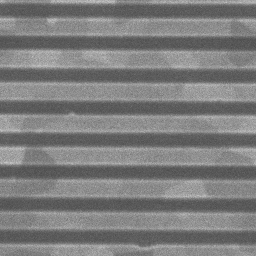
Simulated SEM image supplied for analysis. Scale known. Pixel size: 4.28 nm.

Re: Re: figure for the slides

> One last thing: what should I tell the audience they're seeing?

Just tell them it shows parallel lines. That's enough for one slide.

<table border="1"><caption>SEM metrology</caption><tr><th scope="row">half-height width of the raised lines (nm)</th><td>82.9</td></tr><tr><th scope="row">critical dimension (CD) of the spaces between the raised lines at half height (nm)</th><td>56.7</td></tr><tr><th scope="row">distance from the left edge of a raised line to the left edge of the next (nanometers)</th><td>138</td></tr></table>